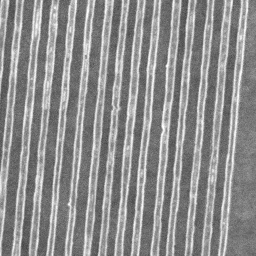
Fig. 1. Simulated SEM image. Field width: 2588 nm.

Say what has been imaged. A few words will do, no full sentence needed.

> parallel lines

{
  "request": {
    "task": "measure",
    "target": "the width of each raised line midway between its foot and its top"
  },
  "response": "61.7 nm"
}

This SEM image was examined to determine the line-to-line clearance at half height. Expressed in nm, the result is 107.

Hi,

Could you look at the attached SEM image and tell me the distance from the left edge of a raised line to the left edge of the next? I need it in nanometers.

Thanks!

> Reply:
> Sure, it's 174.